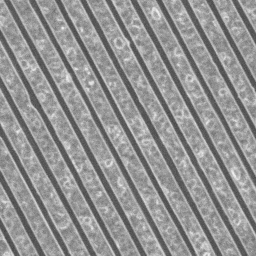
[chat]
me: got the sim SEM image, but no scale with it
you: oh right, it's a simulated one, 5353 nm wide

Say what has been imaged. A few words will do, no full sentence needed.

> parallel lines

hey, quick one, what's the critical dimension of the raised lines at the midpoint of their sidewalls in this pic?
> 16.1 px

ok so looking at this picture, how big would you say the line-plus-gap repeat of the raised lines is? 466 nm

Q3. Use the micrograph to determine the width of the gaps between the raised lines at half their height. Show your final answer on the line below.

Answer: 138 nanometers